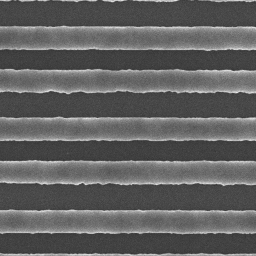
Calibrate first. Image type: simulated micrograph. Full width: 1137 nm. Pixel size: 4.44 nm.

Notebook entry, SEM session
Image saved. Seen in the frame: lines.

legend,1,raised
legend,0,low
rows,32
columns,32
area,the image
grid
00000000000000000000000000000000
00000000000000000000000000000000
00000000000000000000000000000000
11111111111111111111111111111111
11111111111111111111111111111111
11111111111111111111111111111111
00000000000000000000000000000000
00000000000000000000000000000000
00000000000000000000000000000000
11111111111111111111111111111111
11111111111111111111111111111111
00101101100111000100001111101101
00000000000000000000000000000000
00000000000000000000000000000000
00000000000000000000000000000000
11111111111111111111111111111111
11111111111111111111111111111111
11111111111011111011111101101111
00000000000000000000000000000000
00000000000000000000000000000000
11111111111111111111111111111111
11111111111111111111111111111111
11111111111111111111111111111111
00000000000000000000000000000000
00000000000000000000000000000000
00000000000000000000000000000000
11111111111111111111111111111111
11111111111111111111111111111111
11111111111111111111111111111111
00000000000000000000000000000000
00000000000000000000000000000000
00000000000000000000000000000000